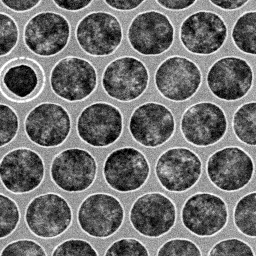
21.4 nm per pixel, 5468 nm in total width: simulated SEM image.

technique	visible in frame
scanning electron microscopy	a regular array of holes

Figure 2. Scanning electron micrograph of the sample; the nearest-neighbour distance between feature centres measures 1110 nanometres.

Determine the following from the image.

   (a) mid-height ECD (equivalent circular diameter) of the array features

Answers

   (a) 952 nm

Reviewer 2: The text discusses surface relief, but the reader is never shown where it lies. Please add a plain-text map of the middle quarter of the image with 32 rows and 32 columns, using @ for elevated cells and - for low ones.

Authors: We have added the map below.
-------@@@@---------@@@@--------
--------@@-----------@@---------
--------@@-----------@@---------
--------@@-----------@@---------
--------@------------@@---------
--------@@-----------@@---------
--------@@----------@@@@--------
------@@@@@--------@@@@@--------
-----@@@@@@@------@@@@@@@@-----@
@@@@@@@@@@@@@@@@@@@@@@@@@@@@@@@@
@@@@@@------@@@@@@@------@@@@@@@
@@@@@---------@@@@--------@@@@@-
-@@@----------@@@----------@@@--
-@@@----------@@@----------@@@--
--@-----------@@@----------@@---
--@------------@------------@---
-@@-----------@@-----------@@---
-@@@----------@@@----------@@@--
-@@@----------@@@---------@@@@--
@@@@@@------@@@@@@@------@@@@@@-
@@@@@@@@---@@@@@@@@@---@@@@@@@@@
@---@@@@@@@@@-----@@@@@@@@-----@
------@@@@@@--------@@@@@-------
-------@@@@---------@@@@--------
--------@@-----------@@---------
--------@@-----------@@---------
--------@@-----------@@---------
--------@@-----------@@---------
--------@@-----------@@---------
-------@@@@---------@@@@--------
------@@@@@@-------@@@@@@-------
-----@@@@@@@@-----@@@@@@@@-----@